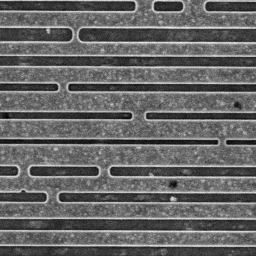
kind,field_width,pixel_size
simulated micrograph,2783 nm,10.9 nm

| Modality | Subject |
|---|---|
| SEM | parallel lines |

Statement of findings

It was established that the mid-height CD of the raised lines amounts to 186 nm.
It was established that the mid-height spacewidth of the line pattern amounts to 111 nm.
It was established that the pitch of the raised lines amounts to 297 nm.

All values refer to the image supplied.